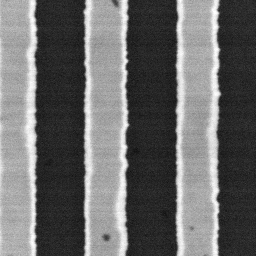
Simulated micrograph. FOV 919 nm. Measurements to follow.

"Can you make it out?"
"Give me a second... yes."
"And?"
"lines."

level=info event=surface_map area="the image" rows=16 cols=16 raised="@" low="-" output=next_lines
@@---@@@---@@@--
@@---@@@---@@@--
@@---@@@---@@@--
@@---@@@---@@@--
@@---@@@---@@@--
@@---@@@---@@@--
@@---@@@---@@@--
@@---@@@---@@@--
@@---@@@---@@@--
@@---@@@---@@@--
@@---@@@---@@@--
@@---@@@---@@@--
@@---@@@---@@@--
@@---@@@---@@@--
@@---@@@---@@@--
@@---@@@---@@@--